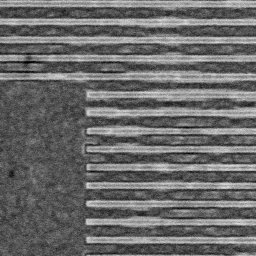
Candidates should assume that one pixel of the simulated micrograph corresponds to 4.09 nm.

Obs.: parallel lines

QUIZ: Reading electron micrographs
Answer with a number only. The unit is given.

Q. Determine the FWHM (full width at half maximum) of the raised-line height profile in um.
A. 0.0225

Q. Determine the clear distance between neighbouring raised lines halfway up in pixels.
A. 12